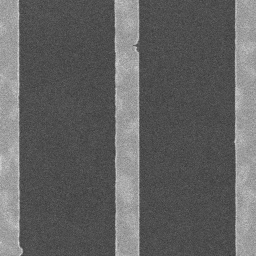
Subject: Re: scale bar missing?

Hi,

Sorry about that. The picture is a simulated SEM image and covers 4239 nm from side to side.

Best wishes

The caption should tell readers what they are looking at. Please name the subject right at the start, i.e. one or a few lines or trenches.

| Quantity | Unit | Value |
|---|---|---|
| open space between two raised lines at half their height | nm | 1610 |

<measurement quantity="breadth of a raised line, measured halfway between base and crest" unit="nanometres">377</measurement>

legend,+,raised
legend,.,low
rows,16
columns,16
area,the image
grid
+......++......+
+......++......+
+......++......+
+......++......+
+......++......+
+......++......+
+......++......+
+......++......+
+......++......+
+......++......+
+......++......+
+......++......+
+......++......+
+......++......+
+......++......+
+......++......+